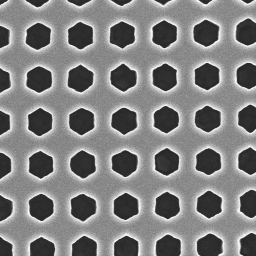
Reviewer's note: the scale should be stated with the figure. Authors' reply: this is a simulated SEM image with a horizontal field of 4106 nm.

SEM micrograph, a regular array of holes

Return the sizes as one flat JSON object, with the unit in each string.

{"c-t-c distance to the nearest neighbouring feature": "0.667 µm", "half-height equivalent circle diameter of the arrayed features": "25.6 pixels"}